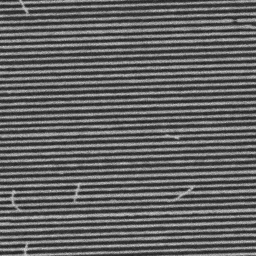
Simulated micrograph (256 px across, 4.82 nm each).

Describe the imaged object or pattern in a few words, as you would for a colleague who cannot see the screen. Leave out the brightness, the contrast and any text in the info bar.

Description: parallel lines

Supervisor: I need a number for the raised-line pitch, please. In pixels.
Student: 6.33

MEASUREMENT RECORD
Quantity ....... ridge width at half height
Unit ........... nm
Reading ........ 12.6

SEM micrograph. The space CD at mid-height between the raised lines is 16.3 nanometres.